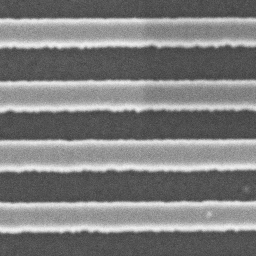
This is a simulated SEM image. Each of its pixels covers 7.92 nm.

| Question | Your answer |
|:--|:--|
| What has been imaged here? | lines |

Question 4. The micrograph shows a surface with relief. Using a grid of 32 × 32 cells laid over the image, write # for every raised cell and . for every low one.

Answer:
................................
................................
################################
################################
################################
################################
................................
................................
................................
................................
################################
################################
################################
################################
................................
................................
................................
................................
################################
################################
################################
................................
................................
................................
................................
################################
################################
################################
################################
................................
................................
................................